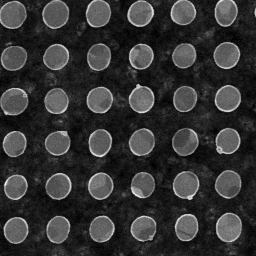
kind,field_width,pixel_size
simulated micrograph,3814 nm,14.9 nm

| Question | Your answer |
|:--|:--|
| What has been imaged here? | a regular array of raised bodies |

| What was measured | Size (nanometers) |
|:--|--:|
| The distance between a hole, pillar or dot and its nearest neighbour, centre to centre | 628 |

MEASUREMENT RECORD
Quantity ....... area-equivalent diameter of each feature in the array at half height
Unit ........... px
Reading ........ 25.2